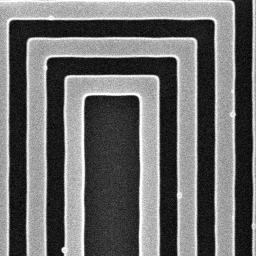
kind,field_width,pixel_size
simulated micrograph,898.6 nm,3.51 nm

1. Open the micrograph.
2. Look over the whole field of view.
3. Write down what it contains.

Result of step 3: groups of lines, slits or small figures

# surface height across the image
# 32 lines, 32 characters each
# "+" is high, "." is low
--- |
+++++++++++++++++++++++++++++...
+++++++++++++++++++++++++++++...
+..........................++...
+..........................++...
+..........................++...
+..++++++++++++++++++++++..++...
+..++++++++++++++++++++++..++...
+..+++................+++..++...
+..+++................+++..++...
+..+++...++++++++++...+++..++...
+..+++..++++++++++++..+++..++...
+..+++..++++++++++++..+++..++...
+..+++..+++......+++..+++..++...
+..+++..++........++..+++..++...
+..+++..++........++..+++..++...
+..+++..++........++..+++..++...
+..+++..++........++..+++..++...
+..+++..++........++..+++..++...
+..+++..++........++..+++..++...
+..+++..++........++..+++..++...
+..+++..++........++..+++..++...
+..+++..++........++..+++..++...
+..+++..++........++..+++..++...
+..+++..++........++..+++..++...
+..+++..++........++..+++..++...
+..+++..++........++..+++..++...
+..+++..++........++..+++..++...
+..+++..++........++..+++..++...
+..+++..++........++..++...++...
+..+++..++........++..+++..++...
+..+++..++........++..+++..++...
+..+++..++........++..+++..++...